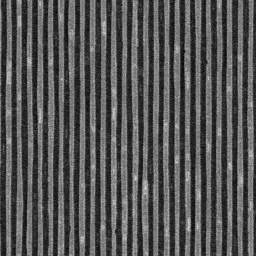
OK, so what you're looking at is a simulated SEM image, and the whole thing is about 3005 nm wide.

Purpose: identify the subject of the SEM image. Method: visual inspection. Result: parallel lines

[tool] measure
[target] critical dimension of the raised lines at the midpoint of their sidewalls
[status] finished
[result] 57.2 nanometres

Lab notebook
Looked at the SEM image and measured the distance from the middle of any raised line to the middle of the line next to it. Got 123 nanometres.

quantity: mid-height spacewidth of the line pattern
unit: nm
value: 69